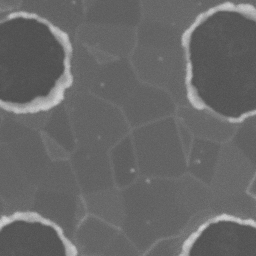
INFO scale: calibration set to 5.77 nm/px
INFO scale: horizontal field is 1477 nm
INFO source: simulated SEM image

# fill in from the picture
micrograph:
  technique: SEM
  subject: holes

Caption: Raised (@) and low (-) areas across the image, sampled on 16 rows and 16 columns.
@@@@@@@@@@@@@@@@
---@@@@@@@@@----
----@@@@@@@@----
----@@@@@@@@----
----@@@@@@@@----
---@@@@@@@@@----
@@@@@@@@@@@@@---
@@@@@@@@@@@@@@@@
@@@@@@@@@@@@@@@@
@@@@@@@@@@@@@@@@
@@@@@@@@@@@@@@@@
@@@@@@@@@@@@@@@@
@@@@@@@@@@@@@@@@
@@@@@@@@@@@@@@@@
----@@@@@@@@@---
----@@@@@@@@----